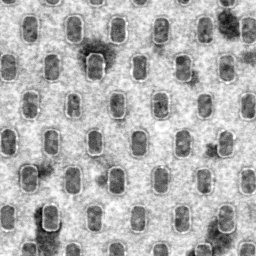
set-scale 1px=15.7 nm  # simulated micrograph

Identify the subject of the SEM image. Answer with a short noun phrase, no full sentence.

a regular array of raised bodies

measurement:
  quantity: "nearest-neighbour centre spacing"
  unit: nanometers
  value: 678